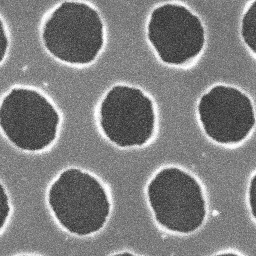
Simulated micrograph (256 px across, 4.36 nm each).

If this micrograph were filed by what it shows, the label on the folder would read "holes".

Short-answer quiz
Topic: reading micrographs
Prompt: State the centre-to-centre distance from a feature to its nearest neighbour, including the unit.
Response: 416 nm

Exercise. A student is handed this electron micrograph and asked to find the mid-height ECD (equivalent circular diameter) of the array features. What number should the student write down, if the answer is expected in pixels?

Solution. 59.8